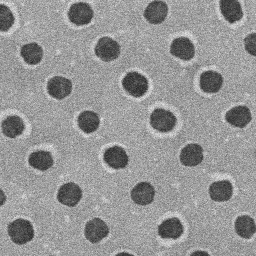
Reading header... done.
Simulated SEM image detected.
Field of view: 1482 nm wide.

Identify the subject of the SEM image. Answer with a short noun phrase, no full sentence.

a regular array of holes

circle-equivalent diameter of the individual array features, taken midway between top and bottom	145	nanometres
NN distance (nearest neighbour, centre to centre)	44.7	pixels